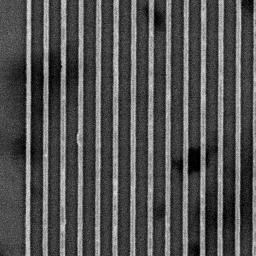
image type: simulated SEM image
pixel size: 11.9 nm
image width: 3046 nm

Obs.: parallel lines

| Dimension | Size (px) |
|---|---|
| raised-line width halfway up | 4.25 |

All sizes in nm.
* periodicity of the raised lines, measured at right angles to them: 208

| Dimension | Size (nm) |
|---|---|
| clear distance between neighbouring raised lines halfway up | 164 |